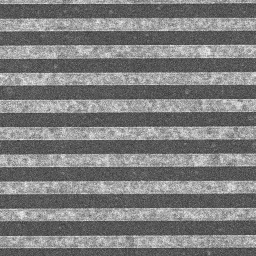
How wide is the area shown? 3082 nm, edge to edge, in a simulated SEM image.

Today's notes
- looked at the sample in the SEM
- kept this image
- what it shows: parallel lines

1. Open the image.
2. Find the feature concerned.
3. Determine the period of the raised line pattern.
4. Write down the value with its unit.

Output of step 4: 327 nm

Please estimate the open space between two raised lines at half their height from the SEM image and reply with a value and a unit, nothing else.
0.187 microns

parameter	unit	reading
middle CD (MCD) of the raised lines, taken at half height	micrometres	0.143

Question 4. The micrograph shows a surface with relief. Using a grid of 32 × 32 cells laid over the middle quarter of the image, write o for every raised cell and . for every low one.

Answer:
................................
................................
oooooooooooooooooooooooooooooooo
oooooooooooooooooooooooooooooooo
oooooooooooooooooooooooooooooooo
................................
................................
................................
................................
oooooooooooooooooooooooooooooooo
oooooooooooooooooooooooooooooooo
oooooooooooooooooooooooooooooooo
................................
................................
................................
................................
oooooooooooooooooooooooooooooooo
oooooooooooooooooooooooooooooooo
oooooooooooooooooooooooooooooooo
................................
................................
................................
................................
oooooooooooooooooooooooooooooooo
oooooooooooooooooooooooooooooooo
................................
................................
................................
................................
.......................ooooooooo
oooooooooooooooooooooooooooooooo
oooooooooooooooooooooooooooooooo